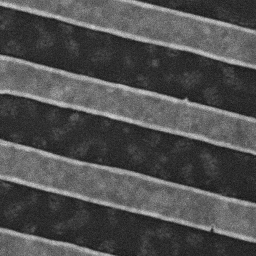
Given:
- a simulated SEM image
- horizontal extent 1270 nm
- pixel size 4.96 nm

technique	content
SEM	one or a few lines or trenches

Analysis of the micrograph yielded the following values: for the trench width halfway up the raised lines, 254 nm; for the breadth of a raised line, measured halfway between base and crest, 167 nm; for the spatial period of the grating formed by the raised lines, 0.417 microns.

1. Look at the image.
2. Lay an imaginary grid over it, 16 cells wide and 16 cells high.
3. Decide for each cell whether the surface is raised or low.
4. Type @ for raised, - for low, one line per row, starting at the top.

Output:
-@@@@@@@@@------
-----@@@@@@@@@--
---------@@@@@@@
-------------@@@
@@@@------------
@@@@@@@@--------
----@@@@@@@@----
--------@@@@@@@@
------------@@@@
@@@-------------
@@@@@@@---------
--@@@@@@@@@-----
------@@@@@@@@--
----------@@@@@@
@-------------@@
@@@@@-----------